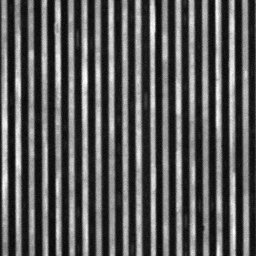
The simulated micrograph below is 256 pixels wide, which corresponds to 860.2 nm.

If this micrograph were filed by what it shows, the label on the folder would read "parallel lines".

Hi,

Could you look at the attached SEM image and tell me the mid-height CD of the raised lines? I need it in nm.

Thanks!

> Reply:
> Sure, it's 19.3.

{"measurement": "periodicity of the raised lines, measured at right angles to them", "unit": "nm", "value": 45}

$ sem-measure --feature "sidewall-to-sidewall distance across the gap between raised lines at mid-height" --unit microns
0.0265